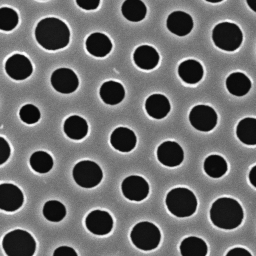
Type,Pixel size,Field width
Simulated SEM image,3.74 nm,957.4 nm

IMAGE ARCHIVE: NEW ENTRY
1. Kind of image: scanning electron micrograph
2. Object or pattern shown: a regular array of holes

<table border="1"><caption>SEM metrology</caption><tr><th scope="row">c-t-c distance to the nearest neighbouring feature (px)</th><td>47.5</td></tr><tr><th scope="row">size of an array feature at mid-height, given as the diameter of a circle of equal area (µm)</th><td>0.0957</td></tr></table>